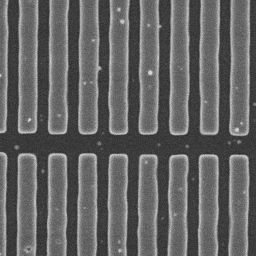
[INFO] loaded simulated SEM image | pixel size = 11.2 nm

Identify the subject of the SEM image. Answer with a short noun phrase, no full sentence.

groups of lines, slits or small figures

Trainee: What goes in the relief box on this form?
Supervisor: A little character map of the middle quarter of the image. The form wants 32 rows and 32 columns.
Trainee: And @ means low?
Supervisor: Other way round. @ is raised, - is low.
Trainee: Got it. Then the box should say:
@---@@@@@---@@@@---@@@@@---@@@@-
@---@@@@@---@@@@---@@@@@---@@@@-
@---@@@@----@@@@---@@@@@---@@@@-
----@@@@----@@@@---@@@@@---@@@@-
----@@@@----@@@@---@@@@@---@@@@-
----@@@@----@@@@---@@@@@---@@@@-
----@@@@---@@@@@---@@@@@---@@@@-
----@@@@---@@@@@---@@@@----@@@@-
----@@@@---@@@@@---@@@@---@@@@@-
----@@@@---@@@@@---@@@@---@@@@@-
@---@@@@---@@@@@---@@@@---@@@@@-
@---@@@@---@@@@@---@@@@---@@@@@-
@---@@@@----@@@@---@@@@---@@@@@-
@---@@@@----@@@@---@@@@---@@@@@-
@---@@@@----@@@@---@@@@---@@@@@-
@---@@@@----@@@@---@@@@---@@@@@-
----@@@@----@@@@---@@@@---@@@@@-
-----@@-----@@@----@@@-----@@@--
--------------------------------
--------------------------------
--------------------------------
--------------------------------
--------------------------------
----@@@@----@@@@---@@@@----@@@@-
----@@@@---@@@@@---@@@@---@@@@@-
----@@@@---@@@@@---@@@@---@@@@@-
----@@@@---@@@@@---@@@@---@@@@@-
----@@@@---@@@@@---@@@@---@@@@@-
@---@@@@---@@@@@---@@@@---@@@@@-
@---@@@@---@@@@@---@@@@---@@@@@-
@---@@@@---@@@@@---@@@@---@@@@@-
@---@@@@---@@@@@---@@@@---@@@@@-